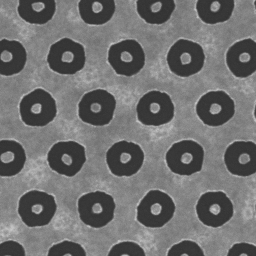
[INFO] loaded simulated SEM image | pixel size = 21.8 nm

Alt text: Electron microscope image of a regular array of ring-shaped grooves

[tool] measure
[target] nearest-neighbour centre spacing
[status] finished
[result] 1260 nm